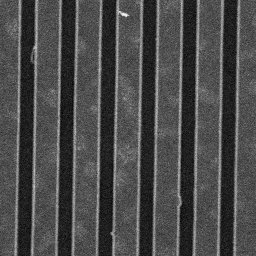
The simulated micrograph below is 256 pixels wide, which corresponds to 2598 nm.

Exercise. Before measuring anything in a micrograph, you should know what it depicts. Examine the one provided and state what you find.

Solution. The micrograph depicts parallel lines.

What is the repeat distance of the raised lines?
411 nanometres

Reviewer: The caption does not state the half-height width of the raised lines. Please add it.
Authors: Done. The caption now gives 25 pixels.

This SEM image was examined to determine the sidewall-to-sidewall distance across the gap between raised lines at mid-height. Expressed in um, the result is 0.16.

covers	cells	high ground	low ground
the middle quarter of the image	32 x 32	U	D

DDDUUUUUUDDDDUUUUUUDDDDUUUUUUDDD
DDDUUUUUUDDDDUUUUUUDDDDUUUUUUDDD
DDDUUUUUUDDDDUUUUUUDDDDUUUUUUDDD
DDDUUUUUUDDDDUUUUUUDDDDUUUUUUDDD
DDDUUUUUUDDDDUUUUUUDDDDUUUUUUDDD
DDDUUUUUUDDDDUUUUUUDDDDUUUUUUDDD
DDDUUUUUUDDDDUUUUUUDDDDUUUUUUDDD
DDDUUUUUUDDDDUUUUUUDDDDUUUUUUDDD
DDDUUUUUUDDDDUUUUUUDDDDUUUUUUDDD
DDDUUUUUUDDDDUUUUUUDDDDUUUUUUDDD
DDDUUUUUUDDDDUUUUUUDDDDUUUUUUDDD
DDDUUUUUUDDDDUUUUUUDDDDUUUUUUDDD
DDDUUUUUUDDDDUUUUUUDDDDUUUUUUDDD
DDDUUUUUUDDDDUUUUUUDDDDUUUUUUDDD
DDDUUUUUUDDDDUUUUUUDDDDUUUUUUDDD
DDDUUUUUUDDDDUUUUUUDDDDUUUUUUDDD
DDDUUUUUUDDDDUUUUUUDDDDUUUUUUDDD
DDDUUUUUUDDDDUUUUUUDDDDUUUUUUDDD
DDDUUUUUUDDDDUUUUUUDDDDUUUUUUDDD
DDDUUUUUUDDDDUUUUUUDDDDUUUUUUDDD
DDDUUUUUUDDDDUUUUUUDDDDUUUUUUDDD
DDDUUUUUUDDDDUUUUUUDDDDUUUUUUDDD
DDDUUUUUUDDDDUUUUUUDDDDUUUUUUDDD
DDDUUUUUUDDDDUUUUUUDDDDUUUUUUDDD
DDDUUUUUUDDDDUUUUUUDDDDUUUUUUDDD
DDDUUUUUUDDDDUUUUUUDDDDUUUUUUDDD
DDDUUUUUUDDDDUUUUUUDDDDUUUUUUDDD
DDDUUUUUUDDDDUUUUUUDDDDUUUUUUDDD
DDDUUUUUUDDDDUUUUUUDDDDUUUUUUDDD
DDDUUUUUUDDDDUUUUUUDDDDUUUUUUDDD
DDDUUUUUUDDDDUUUUUUDDDDUUUUUUDDD
DDDUUUUUUDDDDUUUUUUDDDDUUUUUUDDD